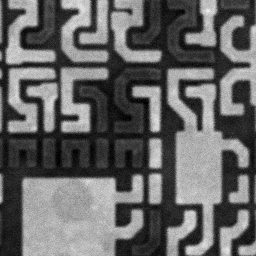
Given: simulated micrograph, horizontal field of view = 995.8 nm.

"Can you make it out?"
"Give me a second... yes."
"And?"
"wiring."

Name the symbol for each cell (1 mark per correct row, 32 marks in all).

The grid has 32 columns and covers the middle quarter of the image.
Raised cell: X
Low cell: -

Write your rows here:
--------------------------------
XXXXXXXXXXX-----XXXXXXXX--XXXXXX
XXXXXXXXXXX----XXXXXXXXX--XXXXXX
XXXXXXXXXXX---XXXXXXXXXX--XXXXXX
XX-----------XXX----------XX----
XX-----------XX-----------XX----
XX--XXXXX----XX--XXXXXXX--XX---X
XX--XXXXXX---XX--XXXXXXX--XX---X
XX------XXX--XX------XXX--XX----
XX------XXX--XXX------XX--XXX---
XXXXXX---XX---XXXXXX--XX---XXX--
XXXXXX---XX----XXXXX--XX----XXX-
XXXXXX---XX-----XXXX--XX-----XXX
----XX---XX------XXX--XX------XX
---XXX---XX-----XXXX--XX------XX
XXXXXX---XX--XXXXXXX--XX------XX
XXXXXX---XX--XXXXXXX--XX------XX
----------------------------XXXX
----------------------------XXXX
XXXXXX--XXX--XXXXXXX--XX----XXXX
XXXXXX--XXX--XXXXXXX--XX----XXXX
XX--XX--XXX--XX--XX---XX----XXXX
XX--XX--XXX--XX--XX---XX----XXXX
XX--XX--XXX--XX--XX---XX----XXXX
XX--XX--XXX--XX--XX---XX----XXXX
XX--XX--XXX--XX---X---XX----XXXX
----------------------------XXXX
----------------------------XXXX
-----------------XX--XXX----XXXX
XXXXXXXXXXXX-----XXX-XXX----XXXX
XXXXXXXXXXXXX----XXX-XXX----XXXX
XXXXXXXXXXXXX----XXX-XXX----XXXX